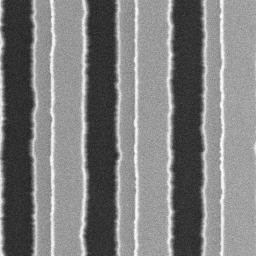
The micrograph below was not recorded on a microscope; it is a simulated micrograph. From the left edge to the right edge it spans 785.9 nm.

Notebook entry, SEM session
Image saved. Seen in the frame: lines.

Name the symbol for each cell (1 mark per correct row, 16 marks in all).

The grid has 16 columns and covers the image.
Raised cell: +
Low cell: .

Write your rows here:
..+++..++++..+++
..+++..++++..+++
..+++..++++..+++
..+++..++++..+++
..+++..++++..+++
..+++..++++..+++
..+++..++++..+++
..+++..++++..+++
..+++..++++..+++
..+++..++++..+++
..+++..++++..+++
..+++..++++..+++
..+++..++++..+++
..+++..++++..+++
..+++..++++..+++
..+++..++++..+++